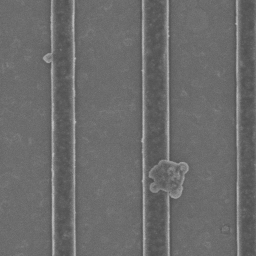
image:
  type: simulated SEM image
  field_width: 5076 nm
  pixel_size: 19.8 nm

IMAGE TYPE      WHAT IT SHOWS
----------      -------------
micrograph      one or a few lines or trenches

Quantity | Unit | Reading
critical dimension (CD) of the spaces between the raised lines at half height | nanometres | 1350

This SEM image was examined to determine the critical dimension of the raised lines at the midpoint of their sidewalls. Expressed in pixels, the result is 25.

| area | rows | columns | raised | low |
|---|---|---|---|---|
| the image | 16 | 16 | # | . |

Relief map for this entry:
...##....##....#
...##....##....#
...##....##....#
...##....##....#
...##....##....#
...##....#.....#
...##....#.....#
...##....##....#
...##....##....#
...##....##....#
...##....###...#
...##....##....#
...##....##....#
...##....##....#
...##....##....#
...##....##....#